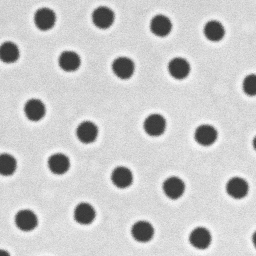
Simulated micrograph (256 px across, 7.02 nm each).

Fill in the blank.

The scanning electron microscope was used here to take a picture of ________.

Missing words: a regular array of holes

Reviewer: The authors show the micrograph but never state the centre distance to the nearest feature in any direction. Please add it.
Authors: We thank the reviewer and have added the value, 368 nm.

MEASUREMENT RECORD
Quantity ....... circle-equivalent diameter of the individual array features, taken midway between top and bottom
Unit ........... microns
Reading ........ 0.166